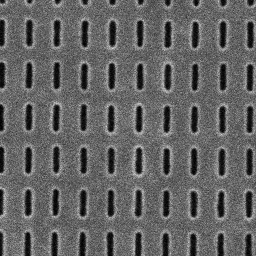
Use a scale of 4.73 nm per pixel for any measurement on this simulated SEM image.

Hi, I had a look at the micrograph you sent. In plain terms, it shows a regular array of holes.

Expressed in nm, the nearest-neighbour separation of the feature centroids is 130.